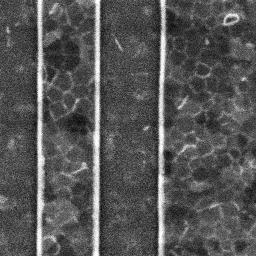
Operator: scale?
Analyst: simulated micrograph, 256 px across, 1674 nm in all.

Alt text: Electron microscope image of one or a few lines or trenches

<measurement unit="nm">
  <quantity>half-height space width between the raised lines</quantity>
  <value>412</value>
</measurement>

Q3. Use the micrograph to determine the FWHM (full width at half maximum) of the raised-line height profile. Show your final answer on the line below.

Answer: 379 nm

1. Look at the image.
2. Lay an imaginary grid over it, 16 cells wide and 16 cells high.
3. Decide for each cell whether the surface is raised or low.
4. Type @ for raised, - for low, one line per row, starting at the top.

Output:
--@@@@----@@@@@@
---@@@----@@@@@@
---@@@----@@@@@@
---@@@----@@@@@@
---@@@----@@@@@@
---@@@----@@@@@@
---@@@----@@@@@@
---@@@----@@@@@@
---@@@----@@@@@@
--@@@@----@@@@@@
--@@@@----@@@@@@
--@@@@----@@@@@@
--@@@@----@@@@@@
--@@@@----@@@@@@
--@@@@----@@@@@@
--@@@@----@@@@@@